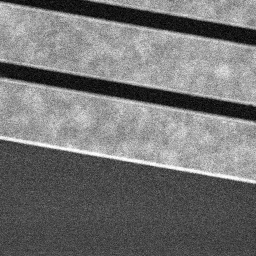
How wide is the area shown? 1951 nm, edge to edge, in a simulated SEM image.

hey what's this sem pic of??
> one or a few lines or trenches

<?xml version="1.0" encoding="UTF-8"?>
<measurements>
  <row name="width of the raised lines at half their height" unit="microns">0.434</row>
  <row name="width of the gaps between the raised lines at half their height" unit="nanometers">144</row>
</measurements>